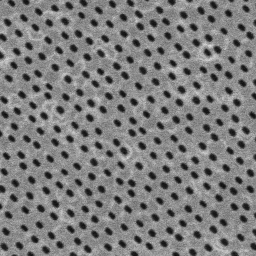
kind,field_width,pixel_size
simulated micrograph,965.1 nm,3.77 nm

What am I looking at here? a regular array of holes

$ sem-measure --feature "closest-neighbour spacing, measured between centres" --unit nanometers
52.2